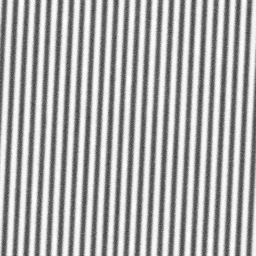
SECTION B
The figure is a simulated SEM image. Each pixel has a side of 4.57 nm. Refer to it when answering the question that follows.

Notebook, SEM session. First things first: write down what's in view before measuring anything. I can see parallel lines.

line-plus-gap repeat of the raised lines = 50.9 nm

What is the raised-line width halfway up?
20.5 nm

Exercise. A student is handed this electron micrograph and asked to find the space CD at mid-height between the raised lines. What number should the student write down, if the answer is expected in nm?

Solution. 28.5